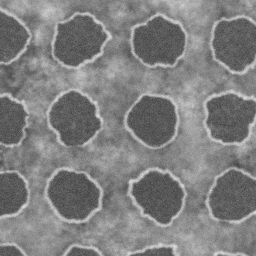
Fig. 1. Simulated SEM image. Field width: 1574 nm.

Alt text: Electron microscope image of raised bodies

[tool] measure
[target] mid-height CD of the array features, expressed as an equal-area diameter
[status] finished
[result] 328 nanometres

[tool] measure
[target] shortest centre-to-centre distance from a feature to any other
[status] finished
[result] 0.471 microns